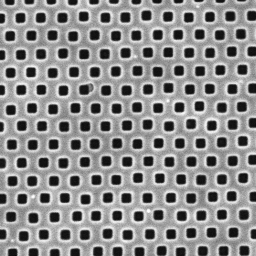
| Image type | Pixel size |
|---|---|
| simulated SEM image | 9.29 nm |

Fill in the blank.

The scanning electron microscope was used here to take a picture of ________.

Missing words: a regular array of holes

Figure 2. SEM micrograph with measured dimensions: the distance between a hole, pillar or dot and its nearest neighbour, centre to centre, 186 nm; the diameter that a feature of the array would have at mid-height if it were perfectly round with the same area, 100 nanometers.